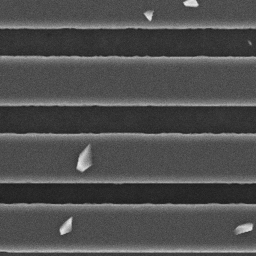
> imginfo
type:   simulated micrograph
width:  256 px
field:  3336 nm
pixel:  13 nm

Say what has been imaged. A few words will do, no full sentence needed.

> lines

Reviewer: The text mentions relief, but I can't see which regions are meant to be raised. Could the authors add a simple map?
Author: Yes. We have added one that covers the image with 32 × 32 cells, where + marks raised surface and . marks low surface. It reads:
++++++++++++++++++++++++++++++++
++++++++++++++++++++++++++++++++
++++++++++++++++++++++++++++++++
++++++++.+++++++..+++++++..++++.
................................
................................
................................
++++++++++++++++++++++++++++++++
++++++++++++++++++++++++++++++++
++++++++++++++++++++++++++++++++
++++++++++++++++++++++++++++++++
++++++++++++++++++++++++++++++++
++++++++++++++++++++++++++++++++
................................
................................
................................
................................
++++++++++++++++++++++++++++++++
++++++++++++++++++++++++++++++++
++++++++++++++++++++++++++++++++
++++++++++++++++++++++++++++++++
++++++++++++++++++++++++++++++++
++++++++++++++++++++++++++++++++
................................
................................
++++++..+.+..+....+.......++.++.
++++++++++++++++++++++++++++++++
++++++++++++++++++++++++++++++++
++++++++++++++++++++++++++++++++
++++++++++++++++++++++++++++++++
++++++++++++++++++++++++++++++++
................................